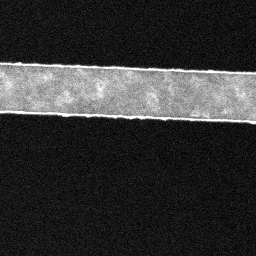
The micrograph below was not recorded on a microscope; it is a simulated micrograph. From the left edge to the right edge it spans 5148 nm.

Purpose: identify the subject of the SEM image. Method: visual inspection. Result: one or a few lines or trenches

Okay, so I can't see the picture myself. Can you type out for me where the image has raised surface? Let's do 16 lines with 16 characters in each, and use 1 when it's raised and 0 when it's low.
1111111111111111
1111111111111111
1111111111111111
1111111111111111
0000000000000111
0000000000000000
0000000000000000
1111111111111000
1111111111111111
1111111111111111
1111111111111111
1111111111111111
1111111111111111
1111111111111111
1111111111111111
1111111111111111